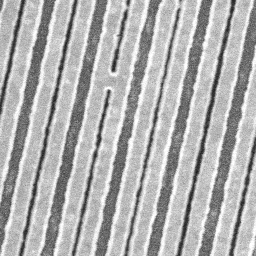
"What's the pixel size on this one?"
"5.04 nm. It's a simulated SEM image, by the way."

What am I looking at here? parallel lines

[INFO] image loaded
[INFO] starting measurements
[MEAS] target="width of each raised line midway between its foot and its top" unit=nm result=77.6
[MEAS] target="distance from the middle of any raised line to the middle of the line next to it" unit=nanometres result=129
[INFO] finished